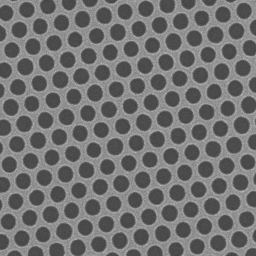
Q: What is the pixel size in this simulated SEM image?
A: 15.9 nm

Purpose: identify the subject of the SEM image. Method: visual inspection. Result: a regular array of holes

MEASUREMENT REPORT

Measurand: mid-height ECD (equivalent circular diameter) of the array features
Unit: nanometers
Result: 252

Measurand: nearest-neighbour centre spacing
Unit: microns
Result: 0.338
